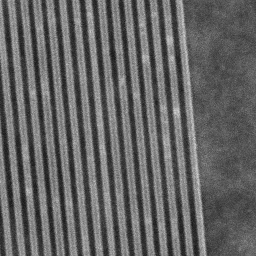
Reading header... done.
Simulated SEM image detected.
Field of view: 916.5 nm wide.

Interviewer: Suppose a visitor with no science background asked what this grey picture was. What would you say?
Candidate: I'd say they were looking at parallel lines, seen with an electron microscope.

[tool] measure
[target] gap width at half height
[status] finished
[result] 0.0231 µm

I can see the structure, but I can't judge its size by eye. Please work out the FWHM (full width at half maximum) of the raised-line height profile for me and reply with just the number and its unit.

23.1 nanometers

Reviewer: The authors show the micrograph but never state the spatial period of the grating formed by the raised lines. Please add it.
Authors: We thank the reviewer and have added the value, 46 nanometres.